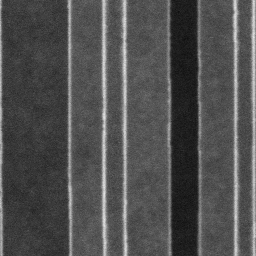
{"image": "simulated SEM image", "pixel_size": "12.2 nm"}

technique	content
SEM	lines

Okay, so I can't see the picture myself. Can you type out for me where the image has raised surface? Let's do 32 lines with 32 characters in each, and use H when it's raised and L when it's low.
LLLLLLLLLHHHHHHHHHHHHLLLLHHHHHHH
LLLLLLLLLHHHHHHHHHHHHLLLLHHHHHHH
LLLLLLLLLHHHHHHHHHHHHLLLLHHHHHHH
LLLLLLLLLHHHHHHHHHHHHLLLLHHHHHHH
LLLLLLLLLHHHHHHHHHHHHLLLLHHHHHHH
LLLLLLLLLHHHHHHHHHHHHLLLLHHHHHHH
LLLLLLLLLHHHHHHHHHHHHLLLLHHHHHHH
LLLLLLLLLHHHHHHHHHHHHLLLLHHHHHHH
LLLLLLLLLHHHHHHHHHHHHLLLLHHHHHHH
LLLLLLLLLHHHHHHHHHHHHLLLLHHHHHHH
LLLLLLLLLHHHHHHHHHHHHLLLLHHHHHHH
LLLLLLLLLHHHHHHHHHHHHLLLLHHHHHHH
LLLLLLLLLHHHHHHHHHHHHLLLLHHHHHHH
LLLLLLLLLHHHHHHHHHHHHLLLLHHHHHHH
LLLLLLLLLHHHHHHHHHHHHLLLLHHHHHHH
LLLLLLLLLHHHHHHHHHHHHLLLLHHHHHHH
LLLLLLLLLHHHHHHHHHHHHLLLLHHHHHHH
LLLLLLLLLHHHHHHHHHHHHLLLLHHHHHHH
LLLLLLLLLHHHHHHHHHHHHLLLLHHHHHHH
LLLLLLLLLHHHHHHHHHHHHLLLLHHHHHHH
LLLLLLLLLHHHHHHHHHHHHLLLLHHHHHHH
LLLLLLLLLHHHHHHHHHHHHLLLLHHHHHHH
LLLLLLLLLHHHHHHHHHHHHLLLLHHHHHHH
LLLLLLLLLHHHHHHHHHHHHLLLLHHHHHHH
LLLLLLLLLHHHHHHHHHHHHLLLLHHHHHHH
LLLLLLLLLHHHHHHHHHHHHLLLLHHHHHHH
LLLLLLLLLHHHHHHHHHHHHLLLLHHHHHHH
LLLLLLLLLHHHHHHHHHHHHLLLLHHHHHHH
LLLLLLLLLHHHHHHHHHHHHLLLLHHHHHHH
LLLLLLLLLHHHHHHHHHHHHLLLLHHHHHHH
LLLLLLLLLHHHHHHHHHHHHLLLLHHHHHHH
LLLLLLLLLHHHHHHHHHHHHLLLLHHHHHHH